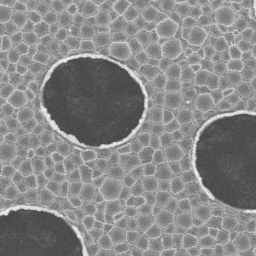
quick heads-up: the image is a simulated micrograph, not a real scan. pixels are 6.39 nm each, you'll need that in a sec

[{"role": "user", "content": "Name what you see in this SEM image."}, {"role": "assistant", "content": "holes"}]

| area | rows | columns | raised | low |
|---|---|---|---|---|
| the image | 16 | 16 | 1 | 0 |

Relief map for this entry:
1111111111111111
1111111111111111
1111111111111111
1111111111111111
1110000011111111
1110000001111111
1110000001111111
1110000001111000
1111000011110000
1111111111110000
1111111111110000
1111111111111000
1111111111111100
0000111111111111
0000011111111111
0000011111111111